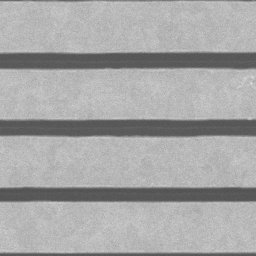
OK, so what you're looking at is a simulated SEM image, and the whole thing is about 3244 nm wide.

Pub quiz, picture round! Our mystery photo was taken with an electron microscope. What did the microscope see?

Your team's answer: lines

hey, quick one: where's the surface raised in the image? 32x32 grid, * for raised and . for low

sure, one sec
********************************
********************************
********************************
********************************
********************************
********************************
**..*..********.................
................................
................................
********************************
********************************
********************************
********************************
********************************
********************************
................................
................................
********************************
********************************
********************************
********************************
********************************
********************************
................................
................................
********************************
********************************
********************************
********************************
********************************
********************************
********************************